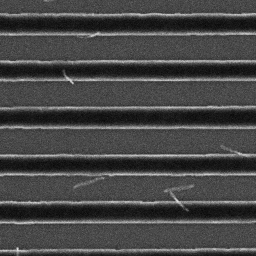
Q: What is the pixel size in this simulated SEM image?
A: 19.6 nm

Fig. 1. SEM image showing lines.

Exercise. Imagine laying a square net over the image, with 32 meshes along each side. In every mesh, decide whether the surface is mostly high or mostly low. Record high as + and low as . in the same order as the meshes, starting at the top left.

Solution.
................................
................................
++++++++++++++++++++++++++++++++
++++++++++++++++++++++++++++++++
................................
................................
................................
................................
++++++++++++++++++++++++++++++++
++++++++++++++++++++++++++++++++
................................
................................
................................
........++++...+++++++++++++++++
++++++++++++++++++++++++++++++++
++++++++++++++++++++++++++++++++
................................
................................
................................
+++++++++++.++++++++++++++++++++
++++++++++++++++++++++++++++++++
++++++++++++++++++++++++++++++++
................................
................................
................................
++++++++++++++++++++++++++++++++
++++++++++++++++++++++++++++++++
++++++++++++++++++++++++++++++++
................................
................................
................................
++++++++++++++++++++++++++++++++